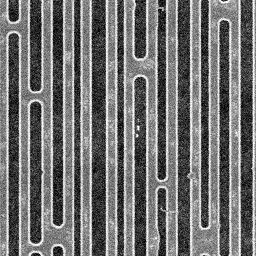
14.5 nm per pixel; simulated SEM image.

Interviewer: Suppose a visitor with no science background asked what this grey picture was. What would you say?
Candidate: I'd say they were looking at parallel lines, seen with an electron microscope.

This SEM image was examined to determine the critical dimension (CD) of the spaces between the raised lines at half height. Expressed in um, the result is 0.173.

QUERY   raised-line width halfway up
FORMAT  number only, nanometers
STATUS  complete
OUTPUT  144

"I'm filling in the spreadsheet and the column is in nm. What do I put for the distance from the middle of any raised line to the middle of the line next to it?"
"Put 306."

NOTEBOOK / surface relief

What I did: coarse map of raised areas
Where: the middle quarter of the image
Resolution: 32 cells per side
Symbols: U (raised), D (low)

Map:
UUDDDUUDDDDUUDDUUUUUUUUDDDUUDDDD
UUDDDUUDDDDUUDDUUUUUUUUDDDUUDDDD
UUDDDUUDDDDUUDDUUUUUUUUDDDUUDDDD
UUDDDUUDDDDUUDDUUUDDUUUDDDUUDDDD
UUDDDUUDDDDUUDDUUDDDDUUDDDUUDDDD
UUDDDUUDDDDUUDDUUDDDDUUDDDUUDDDD
UUDDDUUDDDDUUDDUUDDDDUUDDDUUDDDD
UUDDDUUDDDDUUDDUUDDDDUUDDDUUDDDD
UUDDDUUDDDDUUDDUUDDDDUUDDDUUDDDD
UUDDDUUDDDDUUDDUUDDDDUUDDDUUDDDD
UUDDDUUDDDDUUDDUUDDDDUUDDDUUDDDD
UUDDDUUDDDDUUDDUUDDDDUUDDDUUDDDD
UUDDDUUDDDDUUDDUUDDDDUUDDDUUDDDD
UUDDDUUDDDDUUDDUUDDDDUUDDDUUDDDD
UUDDDUUDDDDUUDDUUDDDDUUDDDUUDDDD
UUDDDUUDDDDUUDDUUDDDDUUDDDUUDDDD
UUDDDUUDDDDUUDDUUDDDDUUDDDUUDDDD
UUDDDUUDDDDUUDDUUDDDDUUDDDUUDDDD
UUDDDUUDDDDUUDDUUDDDDUUDDDUUDDDD
UUDDDUUDDDDUUDDUUDDDDUUDDDUUDDDD
UUDDDUUDDDDUUDDUUDDDDUUDDDUUDDDD
UUDDDUUDDDDUUDDUUDDDDUUDDDUUDDDD
UUDDDUUDDDDUUDDUUDDDDUUDDDUUDDDD
UUDDDUUDDDDUUDDUUDDDDUUDDDUUDDDD
UUDDDUUDDDDUUDDUUDDDDUUDDDUUDDDD
UUDDDUUDDDDUUDDUUDDDDUUDDDUUDDDD
UUDDDUUDDDDUUDDUUDDDDUUDDDUUDDDD
UUDDDUUDDDDUUDDUUDDDDUUDDDUUDDDU
UUDDDUUDDDDUUDDUUDDDDUUDDDUUDDDU
UUDDDUUDDDDUUDDUUDDDDUUUUUUUDDDD
UUDDDUUDDDDUUDDUUDDDDUUUUUUUDDDD
UUDDDUUDDDDUUDDUUDDDDUUDDDUUDDDD